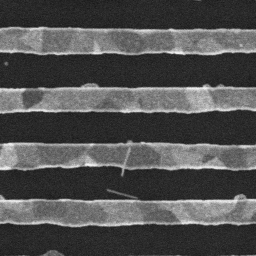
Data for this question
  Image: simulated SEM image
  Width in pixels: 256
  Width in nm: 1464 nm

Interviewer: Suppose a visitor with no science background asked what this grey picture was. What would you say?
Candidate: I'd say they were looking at lines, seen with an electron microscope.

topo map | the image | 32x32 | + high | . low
................................
................................
................................
.++.............................
++++++++++++++++++++++++++++++++
++++++++++++++++++++++++++++++++
...+++++++++++++++++++++++++....
................................
................................
................................
................................
++++++++++++++++++++++++++++++++
++++++++++++++++++++++++++++++++
++++++++++++++++++++++++++++++++
................................
................................
................................
................................
++++++++++++++++++++++++++++++++
++++++++++++++++++++++++++++++++
++++++++++++++++++++++++++++++++
................................
................................
................................
................................
++++++++++++++++++++++++++++++++
++++++++++++++++++++++++++++++++
++++++++++++++++++++++++++++++++
................................
................................
................................
................................